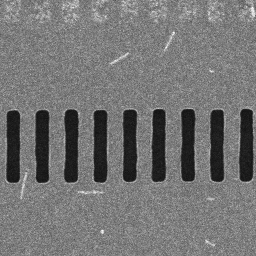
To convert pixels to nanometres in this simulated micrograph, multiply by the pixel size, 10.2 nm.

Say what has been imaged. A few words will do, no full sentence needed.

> a regular array of holes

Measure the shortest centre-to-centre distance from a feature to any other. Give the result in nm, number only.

296